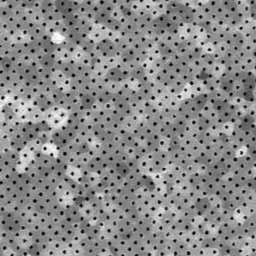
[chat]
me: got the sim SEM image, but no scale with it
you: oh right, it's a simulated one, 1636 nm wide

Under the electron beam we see a regular array of holes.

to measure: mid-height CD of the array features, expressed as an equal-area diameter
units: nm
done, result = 23.9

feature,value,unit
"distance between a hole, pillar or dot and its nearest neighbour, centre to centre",56.5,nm